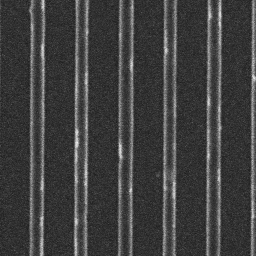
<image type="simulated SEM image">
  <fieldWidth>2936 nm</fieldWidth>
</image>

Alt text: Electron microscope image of parallel lines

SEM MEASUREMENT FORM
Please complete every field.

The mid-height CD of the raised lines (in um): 0.146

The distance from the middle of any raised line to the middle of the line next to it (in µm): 0.507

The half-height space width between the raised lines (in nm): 371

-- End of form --